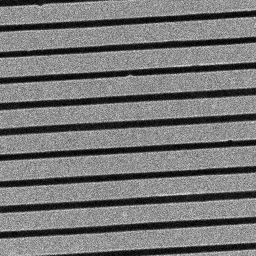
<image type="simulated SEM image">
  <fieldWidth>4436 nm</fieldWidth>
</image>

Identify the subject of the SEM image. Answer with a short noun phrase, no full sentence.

parallel lines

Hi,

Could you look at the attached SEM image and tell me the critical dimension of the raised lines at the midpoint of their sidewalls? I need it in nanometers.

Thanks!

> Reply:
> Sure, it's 329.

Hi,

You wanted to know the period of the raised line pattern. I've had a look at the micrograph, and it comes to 446 nm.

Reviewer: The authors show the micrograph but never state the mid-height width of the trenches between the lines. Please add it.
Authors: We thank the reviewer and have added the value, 104 nm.